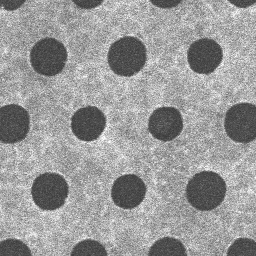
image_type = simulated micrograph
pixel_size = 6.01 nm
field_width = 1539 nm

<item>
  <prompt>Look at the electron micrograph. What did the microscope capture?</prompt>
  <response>a regular array of holes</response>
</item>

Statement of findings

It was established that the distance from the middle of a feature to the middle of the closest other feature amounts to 466 nanometres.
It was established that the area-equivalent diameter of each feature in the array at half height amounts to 0.221 um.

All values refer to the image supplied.